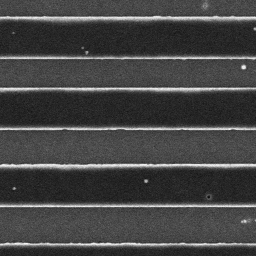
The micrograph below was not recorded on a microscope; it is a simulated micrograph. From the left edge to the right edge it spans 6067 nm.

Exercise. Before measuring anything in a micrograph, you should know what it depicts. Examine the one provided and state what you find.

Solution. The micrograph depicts lines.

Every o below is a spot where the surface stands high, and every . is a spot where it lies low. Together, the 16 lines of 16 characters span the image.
................
oooooooooooooooo
oooooooooooooooo
oooooooooooooooo
................
................
oooooooooooooooo
oooooooooooooooo
................
................
oooooooooooooooo
oooooooooooooooo
oooooooooooooooo
................
................
oooooooooooooooo